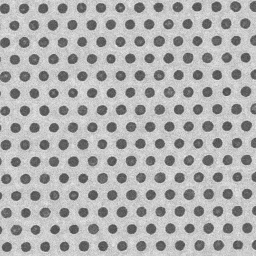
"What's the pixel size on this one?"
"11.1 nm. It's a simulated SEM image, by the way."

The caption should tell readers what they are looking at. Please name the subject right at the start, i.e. a regular array of holes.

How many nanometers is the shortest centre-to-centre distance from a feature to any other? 211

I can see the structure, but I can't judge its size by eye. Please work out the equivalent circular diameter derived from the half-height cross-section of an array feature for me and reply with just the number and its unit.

119 nm